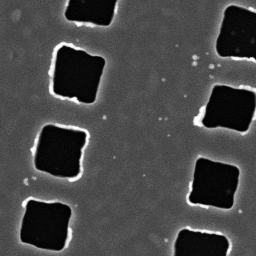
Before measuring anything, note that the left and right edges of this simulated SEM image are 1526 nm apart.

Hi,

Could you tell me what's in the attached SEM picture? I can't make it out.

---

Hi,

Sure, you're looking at holes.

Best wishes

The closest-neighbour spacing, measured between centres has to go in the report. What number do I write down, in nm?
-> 459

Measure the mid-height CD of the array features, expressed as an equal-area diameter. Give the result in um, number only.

0.306